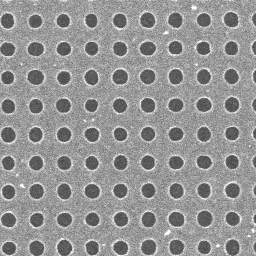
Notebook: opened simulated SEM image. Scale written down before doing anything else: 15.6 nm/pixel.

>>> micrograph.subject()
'a regular array of holes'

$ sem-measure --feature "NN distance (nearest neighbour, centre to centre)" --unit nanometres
432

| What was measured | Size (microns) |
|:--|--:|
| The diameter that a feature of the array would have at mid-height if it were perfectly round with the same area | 0.227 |